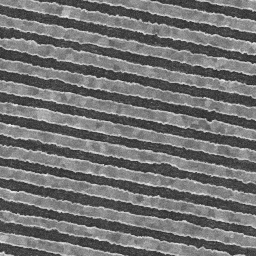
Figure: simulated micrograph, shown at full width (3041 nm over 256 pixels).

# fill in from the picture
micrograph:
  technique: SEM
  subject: parallel lines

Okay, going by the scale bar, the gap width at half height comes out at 117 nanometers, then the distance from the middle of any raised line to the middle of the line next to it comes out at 252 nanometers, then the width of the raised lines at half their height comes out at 127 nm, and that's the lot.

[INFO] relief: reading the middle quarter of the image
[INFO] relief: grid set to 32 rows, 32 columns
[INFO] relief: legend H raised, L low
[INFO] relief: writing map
LLLLLLLLHHHHHHHHHHHHLLLLLLLLLLLL
LLLLLLLLLLLLHHHHHHHHHHHHHHLLLLLL
HHHHLLLLLLLLLLLLLLHHHHHHHHHHHHLL
HHHHHHHHLLLLLLLLLLLLLLHHHHHHHHHH
HHHHHHHHHHHHHHHLLLLLLLLLLLLHHHHH
LLLLLHHHHHHHHHHHHHHHLLLLLLLLLLLL
LLLLLLLLLLHHHHHHHHHHHHHHLLLLLLLL
HHHLLLLLLLLLLLLHHHHHHHHHHHHHHLLL
HHHHHHHLLLLLLLLLLLLLLHHHHHHHHHHH
HHHHHHHHHHHHHLLLLLLLLLLLLLHHHHHH
LLLHHHHHHHHHHHHHHLLLLLLLLLLLLLLL
LLLLLLLLHHHHHHHHHHHHHHLLLLLLLLLL
LLLLLLLLLLLLLHHHHHHHHHHHHHHLLLLL
HHHHHHLLLLLLLLLLLLHHHHHHHHHHHHHH
HHHHHHHHHHHLLLLLLLLLLLLLHHHHHHHH
LHHHHHHHHHHHHHHHLLLLLLLLLLLLHHHH
LLLLLLHHHHHHHHHHHHHHHLLLLLLLLLLL
LLLLLLLLLLLHHHHHHHHHHHHHHLLLLLLL
HHHLLLLLLLLLLLLLHHHHHHHHHHHHHHLL
HHHHHHHHHLLLLLLLLLLLLLHHHHHHHHHH
HHHHHHHHHHHHHHLLLLLLLLLLLLLLHHHH
LLLLHHHHHHHHHHHHHHHLLLLLLLLLLLLL
LLLLLLLLLHHHHHHHHHHHHHHHHLLLLLLL
LLLLLLLLLLLLLLLHHHHHHHHHHHHHHLLL
HHHHHHHLLLLLLLLLLLLHHHHHHHHHHHHH
HHHHHHHHHHHHLLLLLLLLLLLLLLLLHHHH
LLHHHHHHHHHHHHHHLLLLLLLLLLLLLLLH
LLLLLLLHHHHHHHHHHHHHHHLLLLLLLLLL
LLLLLLLLLLLLHHHHHHHHHHHHHHHLLLLL
HHHHHLLLLLLLLLLLLLHHHHHHHHHHHHHH
HHHHHHHHHHHLLLLLLLLLLLLLHHHHHHHH
HHHHHHHHHHHHHHLLLLLLLLLLLLLLLHHH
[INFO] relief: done